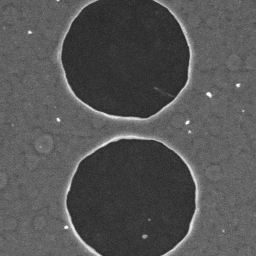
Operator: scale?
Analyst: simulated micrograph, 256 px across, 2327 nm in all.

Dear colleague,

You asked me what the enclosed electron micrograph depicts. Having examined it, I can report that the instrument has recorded holes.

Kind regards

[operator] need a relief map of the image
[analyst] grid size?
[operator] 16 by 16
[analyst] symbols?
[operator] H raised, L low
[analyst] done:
HHHHHLLLLLHHHHHH
HHHHLLLLLLLHHHHH
HHHHLLLLLLLLHHHH
HHHHLLLLLLLLHHHH
HHHHLLLLLLLLHHHH
HHHHLLLLLLLHHHHH
HHHHHLLLLLLHHHHH
HHHHHHHHHHHHHHHH
HHHHHHHHHHHHHHHH
HHHHHHLLLLLHHHHH
HHHHHLLLLLLLHHHH
HHHHLLLLLLLLHHHH
HHHHLLLLLLLLHHHH
HHHHLLLLLLLLHHHH
HHHHHLLLLLLLHHHH
HHHHHHLLLLLHHHHH